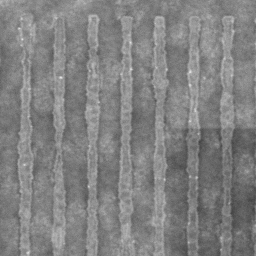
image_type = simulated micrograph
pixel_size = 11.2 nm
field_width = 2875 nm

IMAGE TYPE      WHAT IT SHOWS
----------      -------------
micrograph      parallel lines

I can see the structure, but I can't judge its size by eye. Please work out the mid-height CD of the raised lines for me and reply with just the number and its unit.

104 nm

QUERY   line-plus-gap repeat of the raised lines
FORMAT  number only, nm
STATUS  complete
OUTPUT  377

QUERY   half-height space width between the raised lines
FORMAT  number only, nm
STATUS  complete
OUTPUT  275